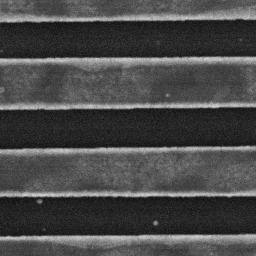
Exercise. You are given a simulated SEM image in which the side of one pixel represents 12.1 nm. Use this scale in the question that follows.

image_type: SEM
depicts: lines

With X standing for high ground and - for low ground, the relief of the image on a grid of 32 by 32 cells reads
XXXXXXXXXXXXXXXXXXXXXXXXXXXXXXXX
XXXXXXXXXXXXXXXXXXXXXXXXXXXXXXXX
XXXXXXXXXXXXXXXX----------------
--------------------------------
--------------------------------
--------------------------------
--------------------------------
-----XXXX-------XXXXXXXXXXXXXXXX
XXXXXXXXXXXXXXXXXXXXXXXXXXXXXXXX
XXXXXXXXXXXXXXXXXXXXXXXXXXXXXXXX
XXXXXXXXXXXXXXXXXXXXXXXXXXXXXXXX
XXXXXXXXXXXXXXXXXXXXXXXXXXXXXXXX
XXXXXXXXXXXXXXXXXXXXXXXXXXXXXXXX
XXXXXXXXX-----------------------
--------------------------------
--------------------------------
--------------------------------
--------------------------------
---------------------------XXXXX
XXXXXXXXXXXXXXXXXXXXXXXXXXXXXXXX
XXXXXXXXXXXXXXXXXXXXXXXXXXXXXXXX
XXXXXXXXXXXXXXXXXXXXXXXXXXXXXXXX
XXXXXXXXXXXXXXXXXXXXXXXXXXXXXXXX
XXXXXXXXXXXXXXXXXXXXXXXXXXXXXXXX
--------------------------------
--------------------------------
--------------------------------
--------------------------------
--------------------------------
--------------------------------
XXXXXXXXXXXXXXXXXXXXXXXXXXXXXXXX
XXXXXXXXXXXXXXXXXXXXXXXXXXXXXXXX